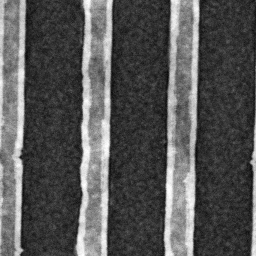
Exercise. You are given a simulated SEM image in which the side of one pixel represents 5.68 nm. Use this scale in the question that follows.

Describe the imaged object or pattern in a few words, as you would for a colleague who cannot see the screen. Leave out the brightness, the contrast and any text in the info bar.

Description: one or a few lines or trenches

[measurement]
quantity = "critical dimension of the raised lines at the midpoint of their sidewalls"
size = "0.126 µm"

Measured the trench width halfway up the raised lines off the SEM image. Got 364 nanometers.